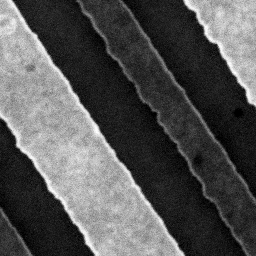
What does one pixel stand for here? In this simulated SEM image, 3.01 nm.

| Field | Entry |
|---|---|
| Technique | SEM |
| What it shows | lines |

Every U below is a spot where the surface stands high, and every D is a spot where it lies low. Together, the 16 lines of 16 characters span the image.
UDDDDUUUDDDDUUUU
UUDDDDUUUDDDDUUU
UUDDDDDUUDDDDUUU
UUUDDDDUUUDDDDUU
UUUUDDDDUUUDDDDU
UUUUDDDDUUUDDDDU
UUUUUDDDDUUUDDDD
UUUUUUDDDDUUUDDD
DUUUUUDDDDDUUDDD
DUUUUUUDDDDUUUDD
DDUUUUUUDDDDUUUD
DDDUUUUUDDDDDUUD
DDDDUUUUUDDDDUUU
DDDDUUUUUUDDDDUU
UDDDDUUUUUDDDDUU
UUDDDDUUUUUDDDDU